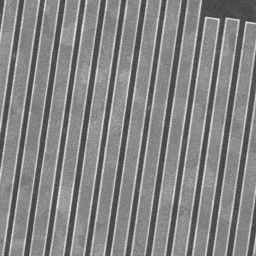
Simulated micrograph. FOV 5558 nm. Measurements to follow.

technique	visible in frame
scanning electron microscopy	parallel lines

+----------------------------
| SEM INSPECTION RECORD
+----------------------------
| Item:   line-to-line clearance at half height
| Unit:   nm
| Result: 137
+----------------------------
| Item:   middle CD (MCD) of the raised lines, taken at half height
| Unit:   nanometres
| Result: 290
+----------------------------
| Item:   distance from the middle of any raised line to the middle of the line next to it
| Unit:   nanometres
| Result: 437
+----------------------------